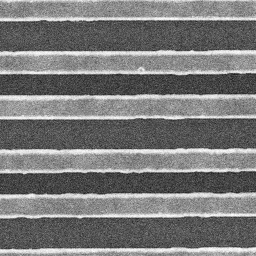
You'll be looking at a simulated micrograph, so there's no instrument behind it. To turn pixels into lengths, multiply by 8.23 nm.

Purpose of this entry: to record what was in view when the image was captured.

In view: lines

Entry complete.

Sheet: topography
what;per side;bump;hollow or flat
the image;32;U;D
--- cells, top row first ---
UUUUUUUUUUUUUUUUUUUUUUUUUUUUUUUU
UUUUUUUUUUUUUUUUUUUUUUUUUUUUUUUU
UUUUDDDDDDDDDDDDDDDDDDDDDDDDDDDD
DDDDDDDDDDDDDDDDDDDDDDDDDDDDDDDD
DDDDDDDDDDDDDDDDDDDDDDDDDDDDDDDD
DDDDDDDDDDDDDDDDDDDDDDDDDDDDDDDD
DDDDUUUUDDDDDDUUUDDUUUUUUUUUUUUU
UUUUUUUUUUUUUUUUUUUUUUUUUUUUUUUU
UUUUUUUUUUUUUUUUUUUUUUUUUUUUUUUU
DDDDDDDDDDDDDDDDDDDDDDDDDDDDDDDD
DDDDDDDDDDDDDDDDDDDDDDDDDDDDDDDD
DDDDDDDDDDDDDDDDDDDDDDDDDDDDDDDD
UUUUUUUUUUUUUUUUUUUUUUUUUUUUUUUU
UUUUUUUUUUUUUUUUUUUUUUUUUUUUUUUU
UUUUUUUUUUUUUUUUUUUUUUUUUUUUUUUU
DDDDDDDDDDDDDDDDDDDDDDDDDDDDDDDD
DDDDDDDDDDDDDDDDDDDDDDDDDDDDDDDD
DDDDDDDDDDDDDDDDDDDDDDDDDDDDDDDD
DDDDDDDDDDDDDDDDDDDDDDDDDDDDDDDD
UUUUUUUUUUUUUUUUUUUUUUUUUUUUUUUU
UUUUUUUUUUUUUUUUUUUUUUUUUUUUUUUU
UUUUUUUUDDUDDDDUUDDDDDDDDDDDDDDD
DDDDDDDDDDDDDDDDDDDDDDDDDDDDDDDD
DDDDDDDDDDDDDDDDDDDDDDDDDDDDDDDD
UUUUUUUUUUUUUUUUUUUUUUUUUUUUUUUU
UUUUUUUUUUUUUUUUUUUUUUUUUUUUUUUU
UUUUUUUUUUUUUUUUUUUUUUUUUUUUUUUU
DDDDDDDDDDDDDDDDDDDDDDDDDDDDDDDD
DDDDDDDDDDDDDDDDDDDDDDDDDDDDDDDD
DDDDDDDDDDDDDDDDDDDDDDDDDDDDDDDD
DDDDDDDDDDDDDDDDDDDDDDDDDDDDDDDD
UUUUUUUUUUUUUUUUUUUUUUUUUUUUUUUU